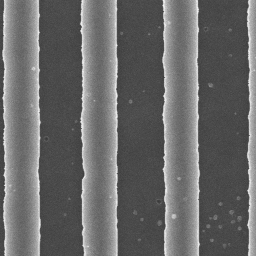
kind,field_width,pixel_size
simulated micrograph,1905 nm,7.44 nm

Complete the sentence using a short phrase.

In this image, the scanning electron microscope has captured lines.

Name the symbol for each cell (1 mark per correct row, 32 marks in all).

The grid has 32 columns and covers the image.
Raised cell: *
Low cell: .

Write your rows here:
.****.....*****.....*****......*
*****.....*****.....*****......*
*****.....*****.....*****......*
*****.....*****.....*****......*
*****.....*****.....*****......*
*****.....*****......****......*
*****.....*****.....*****......*
*****.....*****.....*****......*
.****.....*****.....*****......*
*****.....*****......****......*
*****.....*****......****......*
*****.....*****......****......*
*****.....*****......****......*
*****.....*****.....*****......*
*****.....*****.....*****......*
.****.....*****.....*****......*
*****.....*****......****......*
*****.....*****......****......*
.****.....*****......****......*
.****.....*****......****......*
.****.....*****......****......*
.****......****.....*****......*
.****.....*****......****......*
.****.....*****......****......*
.****.....*****......****......*
*****.....*****......****......*
*****.....*****......****......*
*****.....*****......****......*
.****.....*****......****......*
.****.....*****......****......*
.****.....*****......****......*
.****......****......****......*